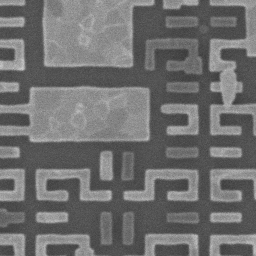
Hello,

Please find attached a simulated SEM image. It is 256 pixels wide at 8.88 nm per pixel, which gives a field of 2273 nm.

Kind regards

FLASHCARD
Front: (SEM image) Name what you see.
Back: wiring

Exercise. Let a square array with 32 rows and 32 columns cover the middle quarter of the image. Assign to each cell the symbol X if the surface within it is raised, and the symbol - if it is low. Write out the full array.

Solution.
-------------XXXX---XXX---XXXXXX
--------------------------XXX-XX
--------------------------------
--------------------------------
--------------------------------
--------------------------XXXXXX
XXXXXXXXXXXXXXXXXXXXX-----XXXXXX
XXXXXXXXXXXXXXXXXXXXX-----------
XXXXXXXXXXXXXXXXXXXXX-----------
XXXXXXXXXXXXXXXXXXXXX-----------
XXXXXXXXXXXXXXXXXXXXX----XXXXXXX
XXXXXXXXXXXXXXXXXXXXX---XXXXXXXX
XXXXXXXXXXXXXXXXXXXXX----------X
XXXXXXXXXXXXXXXXXXXXX----------X
XXXXXXXXXXXXXXXXXXXXX----------X
XXXXXXXXXXXXXXXXXXXXX----------X
XXXXXXXXXXXXXXXXXXXXX-----XXXXXX
XXXXXXXXXXXXXXXXXXXXX-----XXXXXX
XXXXXXXXXXXXXXXXXXXXX-----------
--------------------------------
--------------------------------
--------------------------XXXXXX
---------XXX---XX---------XXXXXX
---------XXX---XX---------------
---------XXX---XX---------------
---------XXX---XX---------------
-----X---XXX---XX---------------
XXXXXX---XXX--XXX----XXXXXXXXXXX
----XX---XXX--XXX---XXX-XXXXXX-X
----XX--------------XX---------X
----XX--------------XX---------X
----XX--------------XX---------X